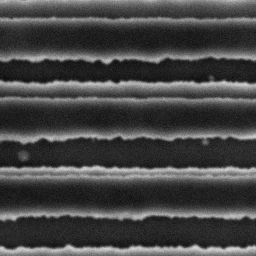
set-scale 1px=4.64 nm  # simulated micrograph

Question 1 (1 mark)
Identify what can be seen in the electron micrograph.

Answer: lines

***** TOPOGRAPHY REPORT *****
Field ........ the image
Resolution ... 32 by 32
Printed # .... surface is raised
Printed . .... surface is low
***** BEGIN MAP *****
################################
################################
################################
################################
################################
################################
################################
#..##..#######...###............
................................
................................
###.#.########.################.
################################
################################
################################
################################
################################
################################
#####.##........................
................................
................................
................................
################################
################################
################################
################################
################################
################################
................................
................................
................................
................................
################################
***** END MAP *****